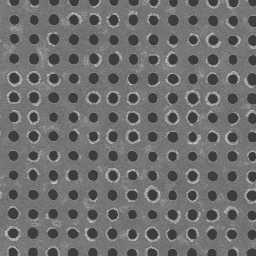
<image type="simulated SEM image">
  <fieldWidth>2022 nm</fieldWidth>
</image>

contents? a regular array of holes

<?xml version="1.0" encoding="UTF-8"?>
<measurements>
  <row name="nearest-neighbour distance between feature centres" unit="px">19.2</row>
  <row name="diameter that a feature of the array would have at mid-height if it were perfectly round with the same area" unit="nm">78.8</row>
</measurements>